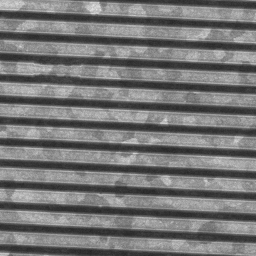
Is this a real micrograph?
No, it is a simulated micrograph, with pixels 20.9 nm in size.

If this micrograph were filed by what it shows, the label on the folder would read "parallel lines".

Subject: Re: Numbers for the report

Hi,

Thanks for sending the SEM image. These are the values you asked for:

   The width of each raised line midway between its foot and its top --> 282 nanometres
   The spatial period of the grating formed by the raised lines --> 444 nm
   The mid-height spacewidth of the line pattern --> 162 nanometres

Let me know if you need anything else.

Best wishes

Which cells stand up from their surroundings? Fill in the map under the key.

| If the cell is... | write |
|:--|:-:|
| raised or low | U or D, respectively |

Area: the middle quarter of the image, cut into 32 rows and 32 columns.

UUUUUUUUUDDDDDDDDDDDDDDDDDDDDDDD
UUUUUUUUUUUUUUUUUUUUUUUUUUUUUUDD
UUUUUUUUUUUUUUUUUUUUUUUUUUUUUUUU
DDDDDDUUUUUUUUUUUUUUUUUUUUUUUUUU
DDDDDDDDDDDDDDDDDDDDDDDDDDDUUUUU
UUUDDDDDDDDDDDDDDDDDDDDDDDDDDDDD
UUUUUUUUUUUUUUUUUUUUUUUUDDDDDDDD
UUUUUUUUUUUUUUUUUUUUUUUUUUUUUUUU
UUUUUUUUUUUUUUUUUUUUUUUUUUUUUUUU
DDDDDDDDDDDDDDDDDDDDUUUUUUUUUUUU
DDDDDDDDDDDDDDDDDDDDDDDDDDDDDDDD
UUUUUUUUUUUUUUUUUDDDDDDDDDDDDDDD
UUUUUUUUUUUUUUUUUUUUUUUUUUUUUUUU
UUUUUUUUUUUUUUUUUUUUUUUUUUUUUUUU
DDDDDDDDDDDDDDUUUUUUUUUUUUUUUUUU
DDDDDDDDDDDDDDDDDDDDDDDDDDDDDDDD
UUUUUUUUUUUDDDDDDDDDDDDDDDDDDDDD
UUUUUUUUUUUUUUUUUUUUUUUUUUUUUUUU
UUUUUUUUUUUUUUUUUUUUUUUUUUUUUUUU
DDDDDDDDUUUUUUUUUUUUUUUUUUUUUUUU
DDDDDDDDDDDDDDDDDDDDDDDDDDDDDUUU
UUUUUDDDDDDDDDDDDDDDDDDDDDDDDDDD
UUUUUUUUUUUUUUUUUUUUUUUUUUDDDDDD
UUUUUUUUUUUUUUUUUUUUUUUUUUUUUUUU
DDUUUUUUUUUUUUUUUUUUUUUUUUUUUUUU
DDDDDDDDDDDDDDDDDDDDDDDUUUUUUUUU
DDDDDDDDDDDDDDDDDDDDDDDDDDDDDDDD
UUUUUUUUUUUUUUUUUUUUDDDDDDDDDDDD
UUUUUUUUUUUUUUUUUUUUUUUUUUUUUUUU
UUUUUUUUUUUUUUUUUUUUUUUUUUUUUUUU
DDDDDDDDDDDDDDDDUUUUUUUUUUUUUUUU
DDDDDDDDDDDDDDDDDDDDDDDDDDDDDDDD